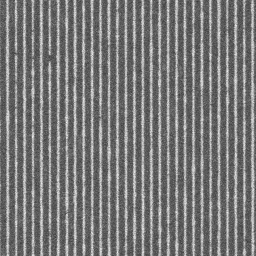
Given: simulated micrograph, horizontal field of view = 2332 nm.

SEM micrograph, parallel lines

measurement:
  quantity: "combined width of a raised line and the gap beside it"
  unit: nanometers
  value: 77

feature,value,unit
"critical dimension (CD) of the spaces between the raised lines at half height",0.0604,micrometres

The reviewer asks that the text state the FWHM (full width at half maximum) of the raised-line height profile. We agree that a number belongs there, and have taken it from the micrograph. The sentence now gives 19.4 nanometres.